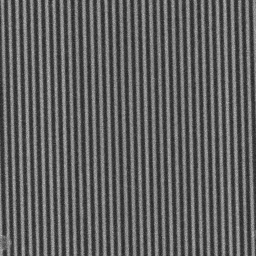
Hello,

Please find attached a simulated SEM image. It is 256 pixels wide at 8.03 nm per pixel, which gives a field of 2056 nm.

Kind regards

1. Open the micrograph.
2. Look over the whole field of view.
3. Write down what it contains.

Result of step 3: parallel lines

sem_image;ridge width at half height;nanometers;21.1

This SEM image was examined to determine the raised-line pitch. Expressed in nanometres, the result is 59.5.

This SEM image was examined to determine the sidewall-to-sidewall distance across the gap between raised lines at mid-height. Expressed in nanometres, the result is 36.1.